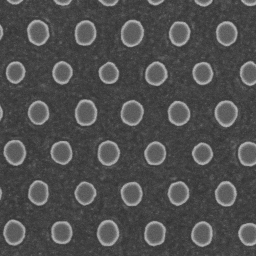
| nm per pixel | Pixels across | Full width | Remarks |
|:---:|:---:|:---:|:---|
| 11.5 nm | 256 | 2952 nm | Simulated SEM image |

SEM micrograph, a regular array of raised bodies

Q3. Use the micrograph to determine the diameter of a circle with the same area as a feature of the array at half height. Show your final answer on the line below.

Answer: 254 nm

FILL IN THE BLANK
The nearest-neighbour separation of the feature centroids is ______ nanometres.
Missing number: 530